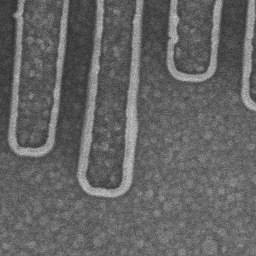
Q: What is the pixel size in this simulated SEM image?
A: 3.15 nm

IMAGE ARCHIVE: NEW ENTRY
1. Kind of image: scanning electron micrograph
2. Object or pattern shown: one or a few lines or trenches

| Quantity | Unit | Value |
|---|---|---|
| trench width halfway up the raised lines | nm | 89.4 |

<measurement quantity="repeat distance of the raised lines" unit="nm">240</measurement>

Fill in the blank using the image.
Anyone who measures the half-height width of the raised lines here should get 151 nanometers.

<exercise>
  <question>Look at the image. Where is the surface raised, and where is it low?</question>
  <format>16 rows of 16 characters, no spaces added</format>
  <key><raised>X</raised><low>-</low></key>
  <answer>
-XXX--XXX--XXX--
-XXX--XXX--XXX-X
-XXX--XXX--XXX-X
-XXX--XXX-XXXX-X
-XXX--XXX--XX--X
-XXX--XXX------X
-XXX-XXX-------X
-XXX-XXX--------
-XX--XXX--------
-XX--XXX--------
-----XXX--------
-----XXX--------
----------------
----------------
----------------
----------------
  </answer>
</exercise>